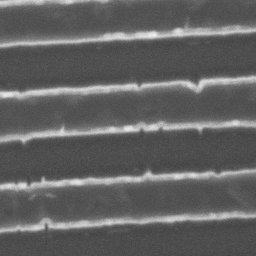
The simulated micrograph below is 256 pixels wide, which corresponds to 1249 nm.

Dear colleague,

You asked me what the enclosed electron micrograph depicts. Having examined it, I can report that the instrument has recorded one or a few lines or trenches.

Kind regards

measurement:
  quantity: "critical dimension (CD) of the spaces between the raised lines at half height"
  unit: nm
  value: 226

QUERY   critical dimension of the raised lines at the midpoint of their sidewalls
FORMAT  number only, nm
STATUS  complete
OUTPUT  222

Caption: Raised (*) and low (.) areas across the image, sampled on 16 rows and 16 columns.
****************
****************
******..........
................
................
......**********
****************
****************
***.............
................
................
..**************
****************
****************
................
................